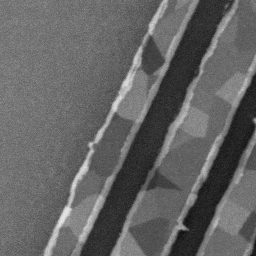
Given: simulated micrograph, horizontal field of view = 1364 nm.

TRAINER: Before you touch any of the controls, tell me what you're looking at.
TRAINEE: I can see one or a few lines or trenches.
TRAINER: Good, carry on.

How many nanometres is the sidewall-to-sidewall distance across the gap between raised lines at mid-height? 169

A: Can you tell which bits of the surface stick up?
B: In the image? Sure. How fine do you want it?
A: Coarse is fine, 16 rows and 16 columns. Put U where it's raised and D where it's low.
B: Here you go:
DDDDDDDDDDUUDDDU
DDDDDDDDDDUUDDUU
DDDDDDDDDUUDDUUU
DDDDDDDDDUUDDUUU
DDDDDDDDUUDDUUUU
DDDDDDDDUUDDUUUD
DDDDDDDUUDDDUUUD
DDDDDDDUUDDUUUDD
DDDDDDUUDDDUUUDD
DDDDDDUUDDUUUDDU
DDDDDUUDDDUUUDDU
DDDDDUUDDUUUUDDU
DDDDUUDDDUUUDDUU
DDDDUUDDUUUDDDUU
DDDDUDDDUUUDDUUU
DDDUUDDUUUUDDUUU